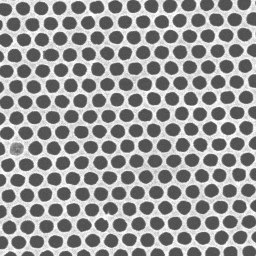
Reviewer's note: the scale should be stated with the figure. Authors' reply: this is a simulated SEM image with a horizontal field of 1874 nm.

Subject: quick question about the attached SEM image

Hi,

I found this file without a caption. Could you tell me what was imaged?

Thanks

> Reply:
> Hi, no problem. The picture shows a regular array of holes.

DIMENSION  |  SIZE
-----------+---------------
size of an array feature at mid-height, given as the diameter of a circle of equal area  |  13.7 pixels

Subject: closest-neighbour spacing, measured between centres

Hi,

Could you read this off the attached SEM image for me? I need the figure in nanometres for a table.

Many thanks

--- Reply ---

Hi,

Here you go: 129